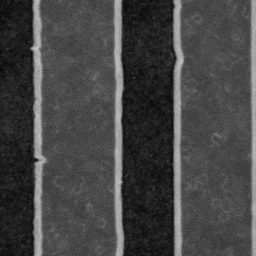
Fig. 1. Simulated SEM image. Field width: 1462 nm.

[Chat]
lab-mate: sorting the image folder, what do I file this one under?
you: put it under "one or a few lines or trenches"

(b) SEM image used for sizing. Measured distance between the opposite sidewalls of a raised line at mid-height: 79.5 pixels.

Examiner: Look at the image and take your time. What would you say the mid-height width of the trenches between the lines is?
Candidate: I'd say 336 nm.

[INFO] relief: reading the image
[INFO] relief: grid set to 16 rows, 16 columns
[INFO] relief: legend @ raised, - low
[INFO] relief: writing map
--@@@@@----@@@@@
--@@@@@----@@@@@
--@@@@@----@@@@@
--@@@@@----@@@@@
--@@@@@----@@@@@
--@@@@@----@@@@@
--@@@@@----@@@@@
--@@@@@----@@@@@
--@@@@@----@@@@@
--@@@@@----@@@@@
--@@@@@----@@@@@
--@@@@@----@@@@@
--@@@@@----@@@@@
--@@@@@----@@@@@
--@@@@@----@@@@@
--@@@@@----@@@@@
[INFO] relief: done